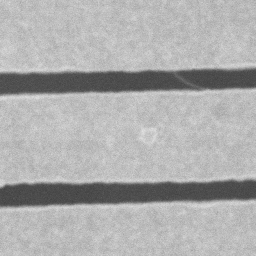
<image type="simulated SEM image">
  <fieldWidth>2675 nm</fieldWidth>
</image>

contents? lines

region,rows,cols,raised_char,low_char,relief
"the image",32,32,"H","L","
HHHHHHHHHHHHHHHHHHHHHHHHHHHHHHHH
HHHHHHHHHHHHHHHHHHHHHHHHHHHHHHHH
HHHHHHHHHHHHHHHHHHHHHHHHHHHHHHHH
HHHHHHHHHHHHHHHHHHHHHHHHHHHHHHHH
HHHHHHHHHHHHHHHHHHHHHHHHHHHHHHHH
HHHHHHHHHHHHHHHHHHHHHHHHHHHHHHHH
HHHHHHHHHHHHHHHHHHHHHHHHHHHHHHHH
HHHHHHHHHHHHHHHHHHHHHHHHHHHHHHHH
HHHHHHHHHHHHHHHHHHHHHHHHHHLLLLLL
LLLLLLLLLLLLLLLLLLLLLLLLLLLLLLLL
LLLLLLLLLLLLLLLLLLLLLLLLLLLLLLLL
LLLLLLLLLLLLLLLLLLLLLHLLLHHHHHHH
HHHHHHHHHHHHHHHHHHHHHHHHHHHHHHHH
HHHHHHHHHHHHHHHHHHHHHHHHHHHHHHHH
HHHHHHHHHHHHHHHHHHHHHHHHHHHHHHHH
HHHHHHHHHHHHHHHHHHHHHHHHHHHHHHHH
HHHHHHHHHHHHHHHHHHHHHHHHHHHHHHHH
HHHHHHHHHHHHHHHHHHHHHHHHHHHHHHHH
HHHHHHHHHHHHHHHHHHHHHHHHHHHHHHHH
HHHHHHHHHHHHHHHHHHHHHHHHHHHHHHHH
HHHHHHHHHHHHHHHHHHHHHHHHHHHHHHHH
HHHHHHHHHHHHHHHHHHHHHHHHHHHHHHHH
HHHHHHHHHHHHHHHHHHHHHHHHHHHLLLLL
LLLLLLLLLLLLLLLLLLLLLLLLLLLLLLLL
LLLLLLLLLLLLLLLLLLLLLLLLLLLLLLLL
LLLLLLLLLLLLLLLLLLLHHHHHHHHHHHHH
HHHHHHHHHHHHHHHHHHHHHHHHHHHHHHHH
HHHHHHHHHHHHHHHHHHHHHHHHHHHHHHHH
HHHHHHHHHHHHHHHHHHHHHHHHHHHHHHHH
HHHHHHHHHHHHHHHHHHHHHHHHHHHHHHHH
HHHHHHHHHHHHHHHHHHHHHHHHHHHHHHHH
HHHHHHHHHHHHHHHHHHHHHHHHHHHHHHHH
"